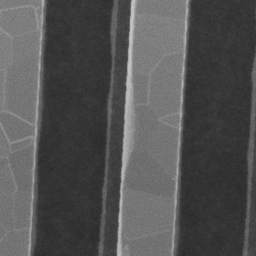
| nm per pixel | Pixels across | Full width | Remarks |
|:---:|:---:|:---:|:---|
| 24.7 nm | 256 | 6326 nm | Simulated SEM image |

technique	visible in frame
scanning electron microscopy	lines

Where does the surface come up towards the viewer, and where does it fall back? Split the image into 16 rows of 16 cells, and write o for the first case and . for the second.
ooo....ooooo....
ooo....ooooo....
ooo....ooooo....
ooo....ooooo....
oo.....oooo.....
oo.....oooo.....
oo.....oooo.....
oo.....oooo.....
oo.....oooo.....
oo.....oooo.....
oo.....oooo.....
oo.....oooo.....
oo.....oooo.....
oo....ooooo.....
oo....ooooo....o
oo....ooooo....o